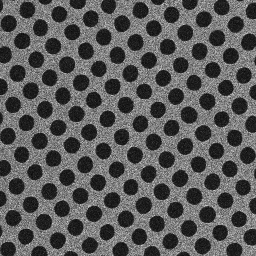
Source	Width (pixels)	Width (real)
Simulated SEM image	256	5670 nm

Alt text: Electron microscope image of a regular array of holes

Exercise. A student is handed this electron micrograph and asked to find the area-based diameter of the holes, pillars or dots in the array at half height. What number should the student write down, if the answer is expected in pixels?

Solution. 16.2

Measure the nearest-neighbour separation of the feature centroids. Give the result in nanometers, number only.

492